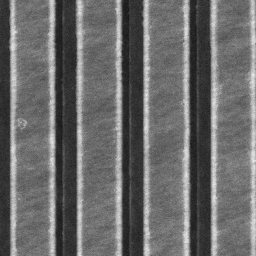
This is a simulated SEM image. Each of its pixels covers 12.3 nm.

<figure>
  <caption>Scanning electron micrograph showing lines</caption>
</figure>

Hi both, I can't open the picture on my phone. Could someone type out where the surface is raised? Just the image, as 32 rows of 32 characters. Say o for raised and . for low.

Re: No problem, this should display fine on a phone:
.oooooo...ooooo...oooooo..oooooo
.oooooo...ooooo...oooooo..oooooo
.oooooo...ooooo...oooooo..oooooo
.oooooo...ooooo...oooooo..oooooo
.oooooo...ooooo...oooooo..oooooo
.oooooo...ooooo...oooooo..oooooo
.oooooo...ooooo...oooooo..oooooo
.oooooo...ooooo...oooooo..oooooo
.oooooo...ooooo...oooooo..oooooo
.oooooo...ooooo...oooooo..oooooo
.oooooo...ooooo...oooooo..oooooo
.oooooo...ooooo...oooooo..oooooo
.oooooo...ooooo...oooooo..oooooo
.oooooo...ooooo...oooooo..oooooo
.oooooo...ooooo...oooooo..oooooo
.oooooo...ooooo...oooooo..oooooo
.oooooo...ooooo...oooooo..oooooo
.oooooo...ooooo...oooooo..oooooo
.oooooo...ooooo...oooooo..oooooo
.oooooo...ooooo...oooooo..oooooo
.oooooo...ooooo...oooooo..oooooo
.oooooo...ooooo...oooooo..oooooo
.oooooo...ooooo...oooooo..oooooo
.oooooo...ooooo...oooooo..oooooo
.oooooo...ooooo...oooooo..oooooo
.oooooo...ooooo...oooooo..oooooo
.oooooo...ooooo...oooooo..oooooo
.oooooo...ooooo...oooooo..oooooo
.oooooo...ooooo...oooooo..oooooo
.oooooo...ooooo...oooooo..oooooo
.oooooo...ooooo...oooooo..oooooo
.oooooo...ooooo...oooooo..oooooo